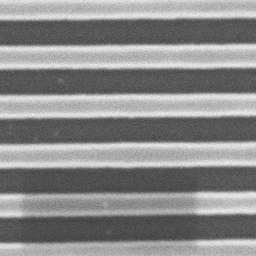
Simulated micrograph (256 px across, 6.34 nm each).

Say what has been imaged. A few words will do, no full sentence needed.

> lines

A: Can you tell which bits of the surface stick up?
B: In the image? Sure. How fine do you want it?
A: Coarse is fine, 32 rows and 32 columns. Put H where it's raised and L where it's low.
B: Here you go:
HHHHHHHHHHHHHHHHHHHHHHHHHHHHHHHH
HHHHHHHHHHHHHHHHHHHHHHHHHHHHHHHH
LLLLLLLLLLLLLLLLLLLLLLLLLLLLLLLL
LLLLLLLLLLLLLLLLLLLLLLLLLLLLLLLL
LLLLLLLLLLLLLLLLLLLLLLLLLLLLLLLL
LLLLLLLLLLLLLLLLLLLLLLLLLLLLLLLL
HHHHHHHHHHHHHHHHHHHHHHHHHHHHHHHH
HHHHHHHHHHHHHHHHHHHHHHHHHHHHHHHH
LLLLLLLLLLLLLLLLLLLLLLLLLLLLLLLL
LLLLLLLLLLLLLLLLLLLLLLLLLLLLLLLL
LLLLLLLLLLLLLLLLLLLLLLLLLLLLLLLL
LLLLLLLLLLLLLLLLLLLLLLLLLLLLLLLL
HHHHHHHHHHHHHHHHHHHHHHHHHHHHHHHH
HHHHHHHHHHHHHHHHHHHHHHHHHHHHHHHH
HHHHHHHHHHHLLLLLHLLLLLLLLLLLLLLL
LLLLLLLLLLLLLLLLLLLLLLLLLLLLLLLL
LLLLLLLLLLLLLLLLLLLLLLLLLLLLLLLL
LLLLLLLLLLLLLLLLLLLLLLLLLLLLLLLL
HHHHHHHHHHHHHHHHHHHHHHHHHHHHHHHH
HHHHHHHHHHHHHHHHHHHHHHHHHHHHHHHH
HHHHHHHHHHHHHHHHHHHHHHHHHHHLLHHH
LLLLLLLLLLLLLLLLLLLLLLLLLLLLLLLL
LLLLLLLLLLLLLLLLLLLLLLLLLLLLLLLL
LLLLLLLLLLLLLLLLLLLLLLLLLLLLLLLL
LLLLLHHHHHHHHHHHHHHHHHHHHHHHHHHH
HHHHHHHHHHHHHHHHHHHHHHHHHHHHHHHH
HHHHHHHHHHHHHHHHHHHHHHHHHHHHHHHH
LLLLLLLLLLLLLLLLLLLLLLLLLLLLLLLL
LLLLLLLLLLLLLLLLLLLLLLLLLLLLLLLL
LLLLLLLLLLLLLLLLLLLLLLLLLLLLLLLL
LLLLLLLLLHHHHHHHHHHHHHHHHHHHHHHH
HHHHHHHHHHHHHHHHHHHHHHHHHHHHHHHH